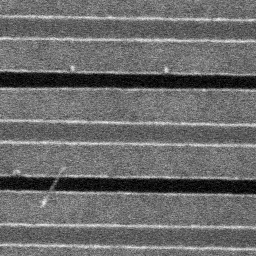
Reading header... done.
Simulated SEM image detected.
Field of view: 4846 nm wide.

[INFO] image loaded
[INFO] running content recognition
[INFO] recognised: lines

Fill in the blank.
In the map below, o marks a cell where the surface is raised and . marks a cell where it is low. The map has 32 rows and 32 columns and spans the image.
................................
................................
ooooooooooooooooooooooooooooo...
oooooooooooooooooooooooooooooooo
oooooooooooooooooooooooooooooooo
................................
................................
................................
................................
oooooooooooooooooooooooooooooooo
oooooooooooooooooooooooooooooooo
................................
................................
................................
................................
oooooooooooooooooooooo..........
oooooooooooooooooooooooooooooooo
oooooooooooooooooooooooooooooooo
................................
................................
................................
................................
oooooooooooooooooooooooooooooooo
oooooooooooooooooooooooooooooooo
...............................o
................................
................................
................................
oooooooooooooooooooooooooooooooo
oooooooooooooooooooooooooooooooo
oooooooooooooooooooooooooooooooo
................................